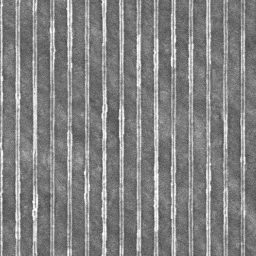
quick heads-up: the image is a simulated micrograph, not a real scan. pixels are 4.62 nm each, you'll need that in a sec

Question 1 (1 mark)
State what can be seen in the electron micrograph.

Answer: parallel lines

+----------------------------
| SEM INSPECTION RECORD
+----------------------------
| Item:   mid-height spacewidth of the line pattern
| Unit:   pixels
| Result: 14.4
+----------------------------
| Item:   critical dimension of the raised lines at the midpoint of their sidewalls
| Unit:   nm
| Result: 14.5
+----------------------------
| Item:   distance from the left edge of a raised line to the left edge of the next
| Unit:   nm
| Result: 79.9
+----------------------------